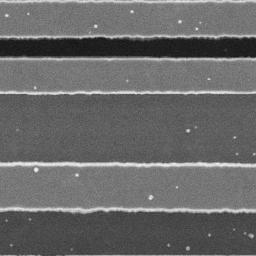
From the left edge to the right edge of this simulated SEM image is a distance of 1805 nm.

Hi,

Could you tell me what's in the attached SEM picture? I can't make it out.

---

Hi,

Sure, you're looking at lines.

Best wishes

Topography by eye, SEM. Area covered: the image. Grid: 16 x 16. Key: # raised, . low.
################
################
................
................
################
################
................
................
................
................
################
################
################
................
................
................